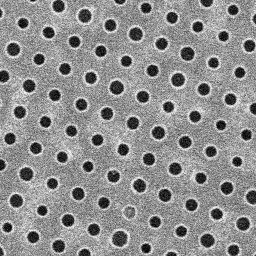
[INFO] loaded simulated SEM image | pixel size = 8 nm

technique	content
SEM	a regular array of holes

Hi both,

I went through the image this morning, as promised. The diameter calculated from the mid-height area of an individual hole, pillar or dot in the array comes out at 102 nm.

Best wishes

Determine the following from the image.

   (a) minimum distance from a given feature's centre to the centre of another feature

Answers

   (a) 219 nm